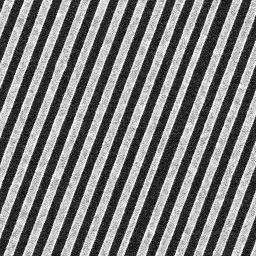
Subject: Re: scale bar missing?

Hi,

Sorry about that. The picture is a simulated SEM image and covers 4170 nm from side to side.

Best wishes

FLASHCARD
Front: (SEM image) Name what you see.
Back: parallel lines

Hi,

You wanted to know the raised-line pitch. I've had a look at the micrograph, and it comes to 289 nm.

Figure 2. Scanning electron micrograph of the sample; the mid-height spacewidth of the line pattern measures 158 nanometres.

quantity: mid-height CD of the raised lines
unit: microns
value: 0.128